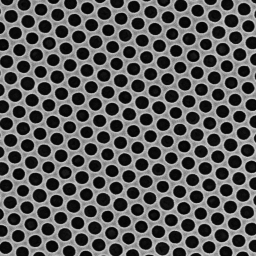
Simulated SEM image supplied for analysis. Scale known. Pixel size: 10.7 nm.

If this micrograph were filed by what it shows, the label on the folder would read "a regular array of holes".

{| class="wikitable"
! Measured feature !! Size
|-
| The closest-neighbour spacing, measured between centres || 17.1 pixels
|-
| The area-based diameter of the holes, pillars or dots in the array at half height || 0.134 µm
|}